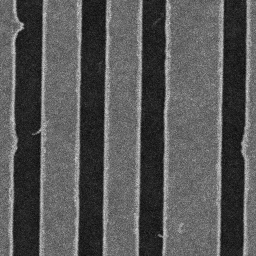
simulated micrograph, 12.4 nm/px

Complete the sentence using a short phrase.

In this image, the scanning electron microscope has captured one or a few lines or trenches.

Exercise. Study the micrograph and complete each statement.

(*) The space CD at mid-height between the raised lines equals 320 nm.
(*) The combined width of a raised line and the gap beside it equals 819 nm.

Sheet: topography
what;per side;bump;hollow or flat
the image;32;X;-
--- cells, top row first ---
XX----XXXX---XXXXX---XXXXXXX---X
XX----XXXX---XXXXX---XXXXXXX---X
XX---XXXXX---XXXXX---XXXXXXX---X
XXX--XXXXX---XXXXX---XXXXXXX---X
XX---XXXXX---XXXXX---XXXXXXX---X
XX---XXXXX---XXXXX---XXXXXXX---X
XX---XXXXX---XXXXX---XXXXXXX---X
XX---XXXXX---XXXXX---XXXXXXX---X
XX---XXXXX---XXXXX---XXXXXXX---X
XX---XXXXX---XXXXX---XXXXXXX---X
XX---XXXXX---XXXX----XXXXXXX---X
XX---XXXXX---XXXX----XXXXXXX---X
XX---XXXXX---XXXX----XXXXXXX---X
XX---XXXXX---XXXX----XXXXXXX---X
XX---XXXXX---XXXX----XXXXXXX---X
XX---XXXXX---XXXX----XXXXXXX---X
XX---XXXXX---XXXX----XXXXXXX---X
XX---XXXXX---XXXX----XXXXXXX--XX
XX---XXXXX---XXXX----XXXXXXX--XX
XX---XXXXX---XXXX----XXXXXX----X
XX---XXXXX---XXXX----XXXXXX----X
XX---XXXXX---XXXX----XXXXXX----X
X----XXXXX---XXXX----XXXXXXX---X
XX---XXXXX---XXXX----XXXXXX----X
XX---XXXXX---XXXX----XXXXXX----X
X----XXXXX---XXXX----XXXXXX----X
X----XXXXX---XXXX----XXXXXX----X
X----XXXXX---XXXX----XXXXXX----X
X----XXXXX---XXXX----XXXXXX----X
X----XXXXX---XXXX---XXXXXXX----X
X----XXXXX---XXXX----XXXXXX----X
X----XXXXX---XXXX---XXXXXXX----X